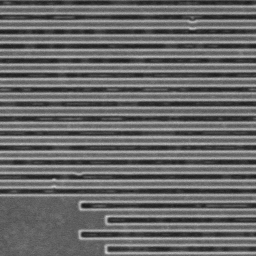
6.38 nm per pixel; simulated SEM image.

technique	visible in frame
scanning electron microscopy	parallel lines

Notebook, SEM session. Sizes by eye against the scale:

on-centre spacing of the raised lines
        0.0925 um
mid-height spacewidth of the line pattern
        0.043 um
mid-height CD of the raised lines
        7.87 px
